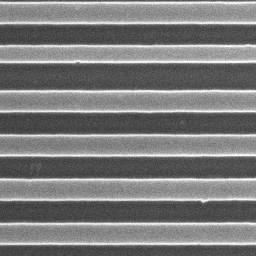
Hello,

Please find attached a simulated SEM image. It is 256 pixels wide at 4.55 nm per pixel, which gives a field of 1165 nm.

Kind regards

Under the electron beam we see parallel lines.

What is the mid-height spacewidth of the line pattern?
0.107 microns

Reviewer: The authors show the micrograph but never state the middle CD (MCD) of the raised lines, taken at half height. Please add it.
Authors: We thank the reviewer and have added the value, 20.9 pixels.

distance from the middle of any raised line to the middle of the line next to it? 201 nm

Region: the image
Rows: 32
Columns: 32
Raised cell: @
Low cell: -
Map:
@@@@@@@@@@@@@@@@@@@@@@@@@@@@@@@@
@@@@@@@@@@@@@@@@@@@@@@@@@@@@@@@@
@@@@@@@@@@@@@@@@@@@@@@@@@@@@@@@@
--------------------------------
--------------------------------
--------------------------------
@@@@@@@@@@@@@@@@@@@@@@@@@@@@@@@@
@@@@@@@@@@@@@@@@@@@@@@@@@@@@@@@@
--------------------------------
--------------------------------
--------------------------------
@@@@@@@@@@@@@@@@@@@@@@@@@@@@@@@@
@@@@@@@@@@@@@@@@@@@@@@@@@@@@@@@@
@@@@@@@@@@@@@@@@@@@@@@@@@@@@@@@@
--------------------------------
--------------------------------
--------------------------------
@@@@@@@@@@@@@@@@@@@@@@@@@@@@@@@@
@@@@@@@@@@@@@@@@@@@@@@@@@@@@@@@@
--------------------------------
--------------------------------
--------------------------------
@@@@@@@@@@@@@@@@@@@@@@@@@@@@@@@@
@@@@@@@@@@@@@@@@@@@@@@@@@@@@@@@@
@@@@@@@@@@@@@@@@@@@@@@@@@@@@@@@@
--------------------------------
--------------------------------
--------------------------------
@@@@@@@@@@@@@@@@@@@@@@@@@@@@@@@@
@@@@@@@@@@@@@@@@@@@@@@@@@@@@@@@@
@@@@@@@@@@@@@@@@@@@@@@@@@@@-----
--------------------------------